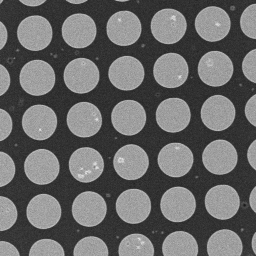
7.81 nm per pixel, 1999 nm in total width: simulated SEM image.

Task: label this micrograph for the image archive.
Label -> an array of small figures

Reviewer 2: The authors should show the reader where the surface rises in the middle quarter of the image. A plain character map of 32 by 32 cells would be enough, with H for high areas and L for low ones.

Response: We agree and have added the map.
LHHHHHHHLLLLHHHHHHHHLLLHHHHHHHHL
HHHHHHHHHLLHHHHHHHHHLLHHHHHHHHHL
HHHHHHHHHLLHHHHHHHHHLLHHHHHHHHHL
HHHHHHHHHLLHHHHHHHHHLLLHHHHHHHHL
HHHHHHHHLLLLHHHHHHHLLLLHHHHHHHLL
LHHHHHHHLLLLLHHHHHHLLLLLLHHHHLLL
LLHHHHHLLLLLLLHLLLLLLLLLLLLLLLLL
LLLLLLLLLLLLLLLLLLLLLLLLLLLLLLLL
LLLLLLLLLLLLLLLLLLLLLLLLLLLLLLLL
LLLLLLLLLLLLLLHHHHLLLLLLLHHHHHLL
LLHHHHHHLLLLLHHHHHHLLLLLHHHHHHHL
LHHHHHHHHLLLHHHHHHHHLLLHHHHHHHHH
LHHHHHHHHLLLHHHHHHHHLLLHHHHHHHHH
LHHHHHHHHLLLHHHHHHHHLLLHHHHHHHHH
LHHHHHHHHLLLHHHHHHHHLLLHHHHHHHHL
LHHHHHHHHLLLHHHHHHHHLLLLHHHHHHHL
LLHHHHHHHLLLLHHHHHHLLLLLLHHHHHLL
LLHHHHHHLLLLLLHHHHLLLLLLLLLLLLLL
LLLLLLLLLLLLLLLLLLLLLLLLLLLLLLLL
LLLLLLLLLLLLLLLLLLLLLLLLLLLLLLLL
LLLLLLLLLLLLLLLHHHHLLLLLLHHHHHLL
LLLHHHHHLLLLLLHHHHHHLLLLHHHHHHHL
LLHHHHHHHLLLLHHHHHHHHLLLHHHHHHHH
LLHHHHHHHHLLLHHHHHHHHLLLHHHHHHHH
LHHHHHHHHHLLHHHHHHHHHLLLHHHHHHHH
LHHHHHHHHHLLHHHHHHHHHLLLHHHHHHHH
LHHHHHHHHHLLLHHHHHHHHLLLHHHHHHHL
LLHHHHHHHLLLLLHHHHHHLLLLLHHHHHLL
LLLHHHHHLLLLLLLHHHHLLLLLLLLLLLLL
LLLLLHLLLLLLLLLLLLLLLLLLLLLLLLLL
LLLLLLLLLLLLLLLLLLLLLLLLLLLLLLLL
LLLLLLLLLLLLLLLLHHHLLLLLLLHHHHHL